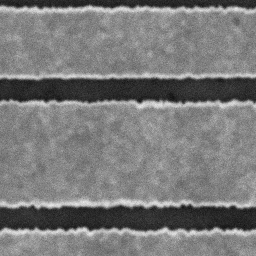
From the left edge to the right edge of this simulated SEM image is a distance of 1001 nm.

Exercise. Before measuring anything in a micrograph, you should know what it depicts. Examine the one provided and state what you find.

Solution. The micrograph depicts lines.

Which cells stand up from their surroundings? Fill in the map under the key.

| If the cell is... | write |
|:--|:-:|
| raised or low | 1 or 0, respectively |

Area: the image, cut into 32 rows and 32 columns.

00000000000000000000000000000000
11111111111111111111111111111111
11111111111111111111111111111111
11111111111111111111111111111111
11111111111111111111111111111111
11111111111111111111111111111111
11111111111111111111111111111111
11111111111111111111111111111111
11111111111111111111111111111111
11111111111111111111111111111111
00000000000000000000000000000000
00000000000000000000000000000000
00000000000000000000000000000000
11111111111111111111111111111111
11111111111111111111111111111111
11111111111111111111111111111111
11111111111111111111111111111111
11111111111111111111111111111111
11111111111111111111111111111111
11111111111111111111111111111111
11111111111111111111111111111111
11111111111111111111111111111111
11111111111111111111111111111111
11111111111111111111111111111111
11111111111111111111111111111111
11111111111111111111111111111111
00000000000000000000000000000000
00000000000000000000000000000000
00000000000000000000000000000000
11111111111111111111111111111111
11111111111111111111111111111111
11111111111111111111111111111111